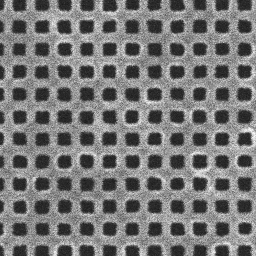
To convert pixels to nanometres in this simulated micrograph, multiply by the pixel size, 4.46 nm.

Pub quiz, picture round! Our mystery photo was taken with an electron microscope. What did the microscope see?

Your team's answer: a regular array of holes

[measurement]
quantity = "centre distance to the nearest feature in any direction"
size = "98.2 nanometers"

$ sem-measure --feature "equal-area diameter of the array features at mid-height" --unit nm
69.1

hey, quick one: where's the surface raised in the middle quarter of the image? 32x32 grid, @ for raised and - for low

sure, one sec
--@@---@@@---@@@---@@---@@@---@@
--@@----@----@@----@@----@@---@@
--@@----@----@@----@@----@----@@
-@@@---@@@---@@@--@@@---@@@---@@
@@@@@@@@@@@@@@@@@@@@@@@@@@@@@@@@
@@@@@@@@@@@@@@@@@@@@@@@@@@@@@@@@
--@@---@@@---@@----@@----@@---@@
--@@----@----@@----@@----@@---@@
--@@----@----@@----@@----@@---@@
@@@@@@@@@@@@@@@@@@@@@@@@@@@@@@@@
@@@@@@@@@@@@@@@@@@@@@@@@@@@@@@@@
-@@@@@@@@@--@@@@--@@@@--@@@-@@@@
--@@---@@----@@----@@----@----@@
--@@----@----@@----@@---@@----@@
--@@---@@@---@@----@@---@@@---@@
@@@@@@@@@@@@@@@@@@@@@@@@@@@@@@@@
@@@@@@@@@@@@@@@@@@@@@@@@@@@@@@@@
--@@---@@@---@@----@@---@@@---@@
--@@----@----@@----@@----@----@@
--@@----@----@@----@@----@----@@
-@@@@--@@@-@@@@@--@@@@--@@@---@@
@@@@@@@@@@@@@@@@@@@@@@@@@@@@@@@@
@@@@@@@@@@@@@@@@@@@@@@@@@@@@@@@@
--@@---@@@---@@----@@---@@@---@@
--@@----@----@@----@@----@@---@@
--@@---@@----@@----@@----@@---@@
@@@@@@@@@@@@@@@@@@@@@@@@@@@@@@@@
@@@@@@@@@@@@@@@@@@@@@@@@@@@@@@@@
-@@@@@-@@@@@@@@@--@@@--@@@@@--@@
--@@----@----@@----@@----@----@@
--@@----@----@@----@@----@----@@
--@@---@@@---@@@---@@---@@@--@@@